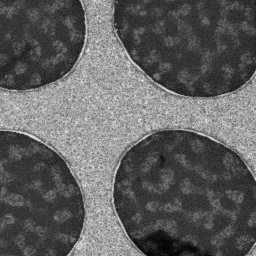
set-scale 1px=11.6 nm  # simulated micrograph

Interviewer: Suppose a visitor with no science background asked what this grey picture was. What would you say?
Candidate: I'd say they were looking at holes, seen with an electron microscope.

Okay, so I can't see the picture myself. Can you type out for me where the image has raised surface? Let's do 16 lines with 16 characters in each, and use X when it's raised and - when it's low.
-----XX---------
-----XX---------
-----XX---------
-----XXX--------
----XXXXX-------
--XXXXXXXX-----X
XXXXXXXXXXXXXXXX
XXXXXXXXXXXXXXXX
--XXXXXXX----XXX
---XXXXX-------X
----XXX--------X
-----XX---------
-----XX---------
-----XX---------
-----XXX--------
-----XXXX-------